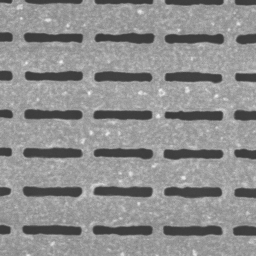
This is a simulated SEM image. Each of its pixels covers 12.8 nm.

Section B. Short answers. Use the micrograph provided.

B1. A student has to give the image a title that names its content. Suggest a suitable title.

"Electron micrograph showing a regular array of holes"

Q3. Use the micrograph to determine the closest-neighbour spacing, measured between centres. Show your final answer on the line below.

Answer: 491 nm